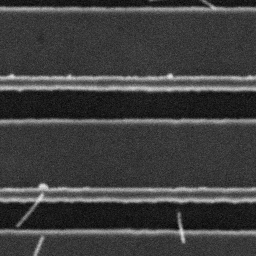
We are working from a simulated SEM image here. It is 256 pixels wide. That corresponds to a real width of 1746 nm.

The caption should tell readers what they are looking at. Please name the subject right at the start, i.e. lines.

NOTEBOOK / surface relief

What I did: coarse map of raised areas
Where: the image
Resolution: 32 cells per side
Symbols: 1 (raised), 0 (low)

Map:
00000000000000000000000000000000
11111111111111111111111111111111
11111111111111111111111111111111
11111111111111111111111111111111
11111111111111111111111111111111
11111111111111111111111111111111
11111111111111111111111111111111
11111111111111111111111111111111
11111111111111111111111111111111
11111111111111111111111111111111
11111111111111111111111111111111
00000000000000000000000000000000
00000000000000000000000000000000
00000000000000000000000000000000
00000000000000000000000000000000
11111111111111111111111111111111
11111111111111111111111111111111
11111111111111111111111111111111
11111111111111111111111111111111
11111111111111111111111111111111
11111111111111111111111111111111
11111111111111111111111111111111
11111111111111111111111111111111
11111111111111111111111111111111
11111111111111111111111111111111
00000000000000000000000000000000
00000000000000000000000000000000
00000000000000000000000000000000
00000000000000000000000000000000
11111111111111111111111111111111
11111111111111111111111111111111
11111111111111111111111111111111